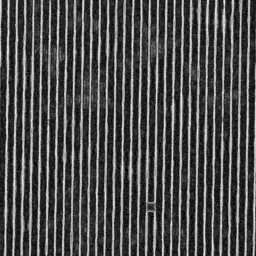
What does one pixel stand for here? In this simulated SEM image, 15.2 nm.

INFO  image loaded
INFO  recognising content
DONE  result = parallel lines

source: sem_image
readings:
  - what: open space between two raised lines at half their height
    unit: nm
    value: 102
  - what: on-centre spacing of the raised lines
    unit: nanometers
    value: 126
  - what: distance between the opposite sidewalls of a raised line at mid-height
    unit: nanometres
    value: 28.4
